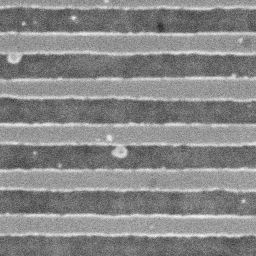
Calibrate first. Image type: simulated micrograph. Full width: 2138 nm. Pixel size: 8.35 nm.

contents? lines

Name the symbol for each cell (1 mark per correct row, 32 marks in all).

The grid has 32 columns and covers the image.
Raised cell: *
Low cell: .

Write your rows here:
********************************
................................
................................
................................
********************************
********************************
********************************
.*..............................
................................
................................
********************************
********************************
.............................***
................................
................................
................................
********************************
********************************
................................
................................
................................
********************************
********************************
********************************
................................
................................
................................
********************************
********************************
...................*...*.*..**..
................................
................................